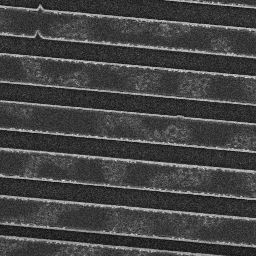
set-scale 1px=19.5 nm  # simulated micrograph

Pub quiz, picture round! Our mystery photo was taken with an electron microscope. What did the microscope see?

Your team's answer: parallel lines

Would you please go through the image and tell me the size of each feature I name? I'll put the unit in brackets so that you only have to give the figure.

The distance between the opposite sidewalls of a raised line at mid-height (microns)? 0.542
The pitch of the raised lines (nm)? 920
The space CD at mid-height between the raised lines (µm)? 0.374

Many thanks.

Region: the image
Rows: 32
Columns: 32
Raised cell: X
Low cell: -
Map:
---------------------------XXXXX
XXXXXXX-------------------------
XXXXXXXXXXXXXXXXXX--------------
XXXXXXXXXXXXXXXXXXXXXXXXXXXXX---
--XX-XXXXXXXXXXXXXXXXXXXXXXXXXXX
-------------XXXXXXXXXXXXXXXXXXX
------------------------XXXXXXXX
XXXXXXXX------------------------
XXXXXXXXXXXXXXXXXXX-------------
XXXXXXXXXXXXXXXXXXXXXXXXXXXXXX--
---XXXXXXXXXXXXXXXXXXXXXXXXXXXXX
--------------XXXXXXXXXXXXXXXXXX
-------------------------XXXXXXX
XXXXXXXXX-----------------------
XXXXXXXXXXXXXXXXXXXX------------
XXXXXXXXXXXXXXXXXXXXXXXXXXXXXXX-
-----XXXXXXXXXXXXXXXXXXXXXXXXXXX
----------------XXXXXXXXXXXXXXXX
---------------------------XXXXX
XXXXXXXXXXX---------------------
XXXXXXXXXXXXXXXXXXXXXX----------
XXXXXXXXXXXXXXXXXXXXXXXXXXXXXXXX
------XXXXXXXXXXXXXXXXXXXXXXXXXX
-----------------XXXXXXXXXXXXXXX
X---------------------------XXXX
XXXXXXXXXXXX--------------------
XXXXXXXXXXXXXXXXXXXXXXX---------
XXXXXXXXXXXXXXXXXXXXXXXXXXXXXXXX
-------XXXXXXXXXXXXXXXXXXXXXXXXX
------------------XXXXXXXXXXXXXX
XXXXXXXXXXX------------------XXX
XXXXXXXXXXXXXXXXXXXXXX----------